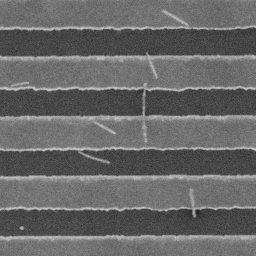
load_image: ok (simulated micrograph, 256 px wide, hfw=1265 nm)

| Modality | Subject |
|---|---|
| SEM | lines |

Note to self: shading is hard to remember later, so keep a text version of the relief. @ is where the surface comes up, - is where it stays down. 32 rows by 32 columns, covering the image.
@@@@@@@@@@@@@@@@@@@@@@@@@@@@@@@@
@@@@@@@@@@@@@@@@@@@@@@@@@@@@@@@@
@@@@@@@@@@@@@@@@@@@@@@@@@@@@@@@@
@@@@@@@@@@@@@@@@@@@@@@-@@@@@@@@-
--------------------------------
--------------------------------
--------------------------------
@@@@@@@@@@@@@@@@@@@@@@@@@@@@@@@@
@@@@@@@@@@@@@@@@@@@@@@@@@@@@@@@@
@@@@@@@@@@@@@@@@@@@@@@@@@@@@@@@@
@@@@@@@@@@@@@@@@@@@@@@@@@@@@@@@@
--------------------------------
--------------------------------
--------------------------------
--------------------------------
@@@@@@@@@@@@@@@@@@@@@@@@@@@@@@@@
@@@@@@@@@@@@@@@@@@@@@@@@@@@@@@@@
@@@@@@@@@@@@@@@@@@@@@@@@@@@@@@@@
@@@@@@@@@@@@@@@@@@@@@@@@@@@@@@@@
--------------------------------
--------------------------------
--------------------------------
@@@@@@@@@@@@@@@@@@@@@@@@@@@@@@@@
@@@@@@@@@@@@@@@@@@@@@@@@@@@@@@@@
@@@@@@@@@@@@@@@@@@@@@@@@@@@@@@@@
@@@@@@@@@@@@@@@@@@@@@@@@@@@@@@@@
--------------------------------
--------------------------------
--------------------------------
--------------------------------
@@@@@@@@@@@@@@@@@@@@@@@@@@@@@@@@
@@@@@@@@@@@@@@@@@@@@@@@@@@@@@@@@